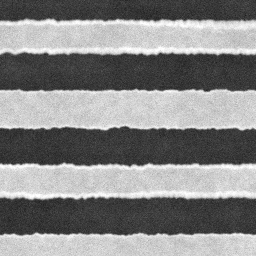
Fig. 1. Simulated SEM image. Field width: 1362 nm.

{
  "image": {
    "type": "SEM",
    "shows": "lines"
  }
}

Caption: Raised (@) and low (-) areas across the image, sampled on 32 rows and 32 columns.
--------------------------------
--------------------------------
--------------------------------
@@@@@@@@@@@@@@@@@@@@@@@@@@@@@@@@
@@@@@@@@@@@@@@@@@@@@@@@@@@@@@@@@
@@@@@@@@@@@@@@@@@@@@@@@@@@@@@@@@
@@@@@@@@@@@@@@@@@@@@@@@@@@@@@@@@
--------------------------------
--------------------------------
--------------------------------
--------------------------------
@@@@@@@@@@@@@@@@@@@@@@@@@@@@@@@@
@@@@@@@@@@@@@@@@@@@@@@@@@@@@@@@@
@@@@@@@@@@@@@@@@@@@@@@@@@@@@@@@@
@@@@@@@@@@@@@@@@@@@@@@@@@@@@@@@@
@@@@@@@@@@@@@@@@@@@@@@@@@@@@@@@@
--------------------------------
--------------------------------
--------------------------------
--------------------------------
---@----@---------@-----@------@
@@@@@@@@@@@@@@@@@@@@@@@@@@@@@@@@
@@@@@@@@@@@@@@@@@@@@@@@@@@@@@@@@
@@@@@@@@@@@@@@@@@@@@@@@@@@@@@@@@
@@@@@@@@@@@@@@@@@@@@@@@@@@@@@@@@
--------------------------------
--------------------------------
--------------------------------
--------------------------------
@@@@@@@@@@@@@@@@@@@@@@@@@@@@@@@@
@@@@@@@@@@@@@@@@@@@@@@@@@@@@@@@@
@@@@@@@@@@@@@@@@@@@@@@@@@@@@@@@@